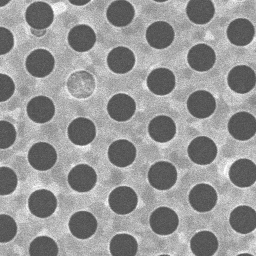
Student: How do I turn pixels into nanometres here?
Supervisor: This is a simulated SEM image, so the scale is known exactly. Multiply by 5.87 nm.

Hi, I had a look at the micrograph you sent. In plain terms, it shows a regular array of holes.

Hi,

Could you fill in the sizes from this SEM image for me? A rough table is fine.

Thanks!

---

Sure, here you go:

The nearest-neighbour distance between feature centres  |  0.268 um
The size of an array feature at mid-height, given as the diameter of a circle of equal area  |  169 nanometres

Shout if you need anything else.